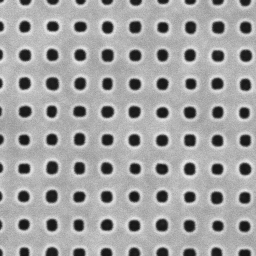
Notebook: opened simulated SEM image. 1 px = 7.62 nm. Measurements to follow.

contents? a regular array of holes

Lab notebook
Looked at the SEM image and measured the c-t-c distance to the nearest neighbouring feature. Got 208 nm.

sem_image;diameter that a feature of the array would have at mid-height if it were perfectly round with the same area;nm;97.6